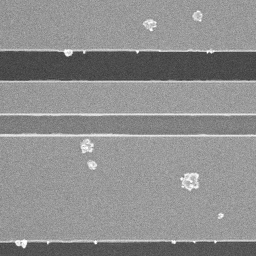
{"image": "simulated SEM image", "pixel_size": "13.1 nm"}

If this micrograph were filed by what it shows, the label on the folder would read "lines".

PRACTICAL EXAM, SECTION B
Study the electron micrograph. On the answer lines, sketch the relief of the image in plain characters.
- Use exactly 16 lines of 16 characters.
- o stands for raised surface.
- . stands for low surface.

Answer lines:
oooooooooooooooo
oooooooooooooooo
oooooooooooooooo
................
................
oooooooooooooooo
oooooooooooooooo
oooooooooooooooo
oooooooooooooooo
oooooooooooooooo
oooooooooooooooo
oooooooooooooooo
oooooooooooooooo
oooooooooooooooo
oooooooooooooooo
................